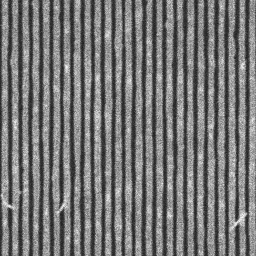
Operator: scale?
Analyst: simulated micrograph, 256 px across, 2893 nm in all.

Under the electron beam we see parallel lines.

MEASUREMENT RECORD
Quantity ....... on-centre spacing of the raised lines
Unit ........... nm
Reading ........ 117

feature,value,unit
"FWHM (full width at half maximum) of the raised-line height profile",73.5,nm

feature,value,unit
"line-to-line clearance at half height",42.4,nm